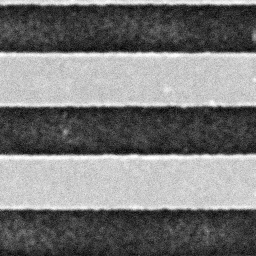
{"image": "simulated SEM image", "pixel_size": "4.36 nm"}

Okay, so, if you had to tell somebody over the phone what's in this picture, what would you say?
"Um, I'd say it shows lines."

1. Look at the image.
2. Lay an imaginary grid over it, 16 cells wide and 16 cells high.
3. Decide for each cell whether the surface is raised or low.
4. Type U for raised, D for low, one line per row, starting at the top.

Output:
DDDDDDDDDDDDDDDD
DDDDDDDDDDDDDDDD
DDDDDDDDDDDDDDDD
UUUUUUUUUUUUUUUU
UUUUUUUUUUUUUUUU
UUUUUUUUUUUUUUUU
UUUUUUUUUUUUUUUU
DDDDDDDDDDDDDDDD
DDDDDDDDDDDDDDDD
DDDDDDDDDDDDDDDD
UUUUUUUUUUUUUUUU
UUUUUUUUUUUUUUUU
UUUUUUUUUUUUUUUU
DDDDDDDDDDDDDDDD
DDDDDDDDDDDDDDDD
DDDDDDDDDDDDDDDD